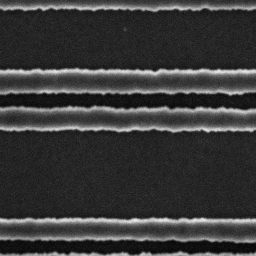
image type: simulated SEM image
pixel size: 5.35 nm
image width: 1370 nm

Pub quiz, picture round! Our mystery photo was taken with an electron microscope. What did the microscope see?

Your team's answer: lines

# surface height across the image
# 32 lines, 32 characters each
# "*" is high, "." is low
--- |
********************************
................................
................................
................................
................................
................................
................................
................................
................................
********************************
********************************
*******************************.
................................
****...*******......*....*......
********************************
********************************
................................
................................
................................
................................
................................
................................
................................
................................
................................
................................
................................
*..***********....***.*.**.....*
********************************
********************************
................................
................................